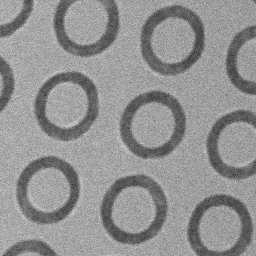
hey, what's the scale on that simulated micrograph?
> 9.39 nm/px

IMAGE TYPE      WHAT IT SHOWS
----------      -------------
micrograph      ring-shaped grooves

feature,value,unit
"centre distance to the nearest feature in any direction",811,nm